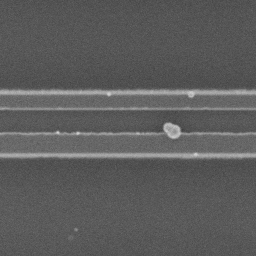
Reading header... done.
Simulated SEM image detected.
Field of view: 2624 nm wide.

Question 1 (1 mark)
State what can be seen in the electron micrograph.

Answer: lines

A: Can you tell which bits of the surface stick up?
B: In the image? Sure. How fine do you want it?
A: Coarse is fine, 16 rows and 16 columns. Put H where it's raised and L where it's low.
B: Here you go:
LLLLLLLLLLLLLLLL
LLLLLLLLLLLLLLLL
LLLLLLLLLLLLLLLL
LLLLLLLLLLLLLLLL
LLLLLLLLLLLLLLLL
LLLLLLLLLLLLLLLL
HHHHHHHHHHHHHHHH
HHHHHHHHHHHHHHHH
HHHHHHHHHHHHHHHH
HHHHHHHHHHHHHHHH
LLLLLLLLLLLLLLLL
LLLLLLLLLLLLLLLL
LLLLLLLLLLLLLLLL
LLLLLLLLLLLLLLLL
LLLLLLLLLLLLLLLL
LLLLLLLLLLLLLLLL